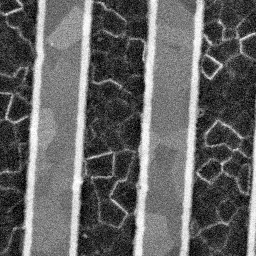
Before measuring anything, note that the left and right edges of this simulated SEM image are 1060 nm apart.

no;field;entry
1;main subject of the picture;one or a few lines or trenches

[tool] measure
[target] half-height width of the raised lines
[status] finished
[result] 188 nm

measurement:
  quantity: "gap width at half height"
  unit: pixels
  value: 66.1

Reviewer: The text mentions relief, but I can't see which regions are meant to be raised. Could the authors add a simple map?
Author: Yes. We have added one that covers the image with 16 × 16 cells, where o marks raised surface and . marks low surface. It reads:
...oo.....oo....
...oo.....oo....
..ooo....ooo....
..ooo....ooo....
..ooo....ooo....
..ooo....ooo....
..ooo....ooo....
..ooo....ooo....
..ooo....ooo....
..ooo....ooo....
..ooo....ooo....
..ooo....ooo....
..ooo....ooo....
..ooo....ooo....
..ooo....ooo....
..ooo....ooo....